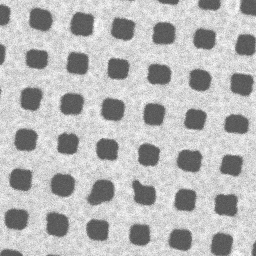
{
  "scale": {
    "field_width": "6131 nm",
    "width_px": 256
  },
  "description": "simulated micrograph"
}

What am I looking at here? a regular array of holes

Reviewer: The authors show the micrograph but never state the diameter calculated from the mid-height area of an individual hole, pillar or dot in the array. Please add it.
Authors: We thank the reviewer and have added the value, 24.1 pixels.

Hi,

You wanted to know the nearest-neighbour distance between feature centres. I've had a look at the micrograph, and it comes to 955 nanometers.